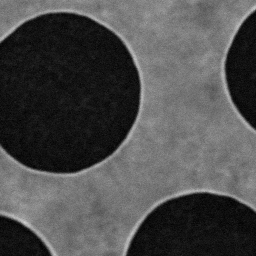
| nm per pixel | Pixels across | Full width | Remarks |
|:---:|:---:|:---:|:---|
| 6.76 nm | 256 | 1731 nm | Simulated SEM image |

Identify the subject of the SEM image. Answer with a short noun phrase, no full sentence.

holes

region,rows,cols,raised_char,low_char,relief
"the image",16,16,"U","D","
UUUUUUUUUUUUUUUU
UDDDDDUUUUUUUUUD
DDDDDDDDUUUUUUUD
DDDDDDDDUUUUUUDD
DDDDDDDDDUUUUUDD
DDDDDDDDDUUUUUDD
DDDDDDDDDUUUUUUD
DDDDDDDDUUUUUUUD
DDDDDDDDUUUUUUUU
DDDDDDDUUUUUUUUU
UUDDDDUUUUUUUUUU
UUUUUUUUUUUUUUUU
UUUUUUUUUUDDDDDU
UUUUUUUUUDDDDDDD
DDUUUUUUDDDDDDDD
DDDUUUUUDDDDDDDD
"